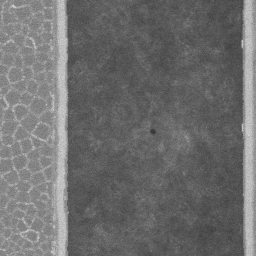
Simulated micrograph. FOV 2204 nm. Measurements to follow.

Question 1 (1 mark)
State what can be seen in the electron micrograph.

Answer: one or a few lines or trenches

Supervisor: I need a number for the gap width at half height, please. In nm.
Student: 1620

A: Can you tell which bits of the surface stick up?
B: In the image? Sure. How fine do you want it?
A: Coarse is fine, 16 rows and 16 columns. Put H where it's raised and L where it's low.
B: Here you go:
HHHHLLLLLLLLLLLL
HHHHLLLLLLLLLLLL
HHHHLLLLLLLLLLLL
HHHHLLLLLLLLLLLL
HHHHLLLLLLLLLLLL
HHHHLLLLLLLLLLLL
HHHHLLLLLLLLLLLL
HHHHLLLLLLLLLLLL
HHHHLLLLLLLLLLLL
HHHHLLLLLLLLLLLL
HHHHLLLLLLLLLLLL
HHHHLLLLLLLLLLLL
HHHHLLLLLLLLLLLL
HHHHLLLLLLLLLLLL
HHHHLLLLLLLLLLLL
HHHHLLLLLLLLLLLL